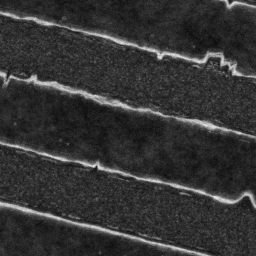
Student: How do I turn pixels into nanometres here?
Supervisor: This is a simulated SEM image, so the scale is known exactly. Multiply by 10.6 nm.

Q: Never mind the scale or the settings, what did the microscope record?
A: one or a few lines or trenches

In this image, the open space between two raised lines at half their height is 633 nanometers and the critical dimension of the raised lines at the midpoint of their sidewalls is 0.709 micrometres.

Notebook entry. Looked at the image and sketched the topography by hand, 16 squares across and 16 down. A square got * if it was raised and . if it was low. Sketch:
****************
...*************
.......*********
...........*****
...............*
****............
*******.........
************....
****************
..**************
......**********
..........******
..............*.
***.............
*******.........
***********.....